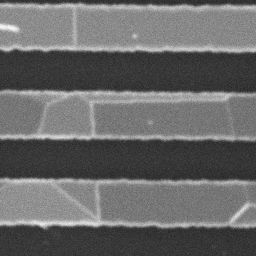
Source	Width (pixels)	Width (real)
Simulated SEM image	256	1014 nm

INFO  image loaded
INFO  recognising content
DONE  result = lines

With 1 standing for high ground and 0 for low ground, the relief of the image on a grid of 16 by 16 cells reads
1111111111111111
1111111111111111
1111111111111111
0000000000000000
0000000000000000
0000000000000000
1111111111111111
1111111111111111
1111111111111111
0000000000000000
0000000000000000
1111111111111111
1111111111111111
1111111111111111
0000000000000000
0000000000000000